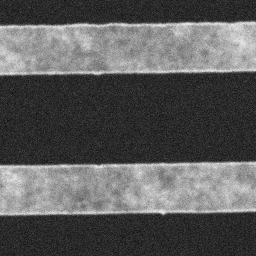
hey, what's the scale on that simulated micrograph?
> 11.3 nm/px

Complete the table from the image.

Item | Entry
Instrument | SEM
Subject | one or a few lines or trenches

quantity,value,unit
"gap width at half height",530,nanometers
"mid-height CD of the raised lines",1060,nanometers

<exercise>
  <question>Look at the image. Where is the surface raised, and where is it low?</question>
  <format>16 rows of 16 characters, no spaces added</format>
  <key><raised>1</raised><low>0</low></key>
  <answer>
1111111111111111
1111111111110010
0000000000000000
0000000000000000
0000000010111111
1111111111111111
1111111111111111
1111111111111111
1111111111111111
1111111111111111
0000000000000000
0000000000000000
0000000000000000
1111111111111111
1111111111111111
1111111111111111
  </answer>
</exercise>